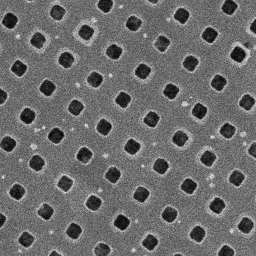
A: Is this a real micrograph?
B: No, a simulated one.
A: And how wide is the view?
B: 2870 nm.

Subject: a regular array of holes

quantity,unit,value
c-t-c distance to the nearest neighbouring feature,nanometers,378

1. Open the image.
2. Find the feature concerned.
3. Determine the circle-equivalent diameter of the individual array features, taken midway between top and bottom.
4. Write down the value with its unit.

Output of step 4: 178 nanometers